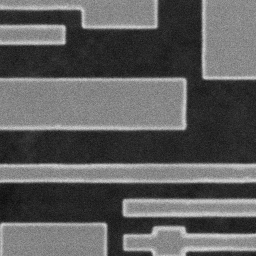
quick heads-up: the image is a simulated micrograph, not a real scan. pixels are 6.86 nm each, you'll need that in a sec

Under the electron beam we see wiring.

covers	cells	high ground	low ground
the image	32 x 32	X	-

XXXXXXXXXXXXXXXXXXXX-----XXXXXXX
----------XXXXXXXXXX-----XXXXXXX
----------XXXXXXXXXX-----XXXXXXX
XXXXXXXX-----------------XXXXXXX
XXXXXXXX-----------------XXXXXXX
-------------------------XXXXXXX
-------------------------XXXXXXX
-------------------------XXXXXXX
-------------------------XXXXXXX
--------------------------XXXXXX
XXXXXXXXXXXXXXXXXXXXXXX---------
XXXXXXXXXXXXXXXXXXXXXXX---------
XXXXXXXXXXXXXXXXXXXXXXX---------
XXXXXXXXXXXXXXXXXXXXXXX---------
XXXXXXXXXXXXXXXXXXXXXXX---------
XXXXXXXXXXXXXXXXXXXXXXX---------
--------------------------------
--------------------------------
--------------------------------
--------------------------------
--------------------------------
XXXXXXXXXXXXXXXXXXXXXXXXXXXXXXXX
XXXXXXXXXXXXXXXXXXXXXXXXXXXXXXXX
--------------------------------
--------------------------------
----------------XXXXXXXXXXXXXXXX
----------------XXXXXXXXXXXXXXXX
--------------------------------
XXXXXXXXXXXXX-------XXX---------
XXXXXXXXXXXXX---XXXXXXXXXXXXXXXX
XXXXXXXXXXXXX---XXXXXXXXXXXXXXXX
XXXXXXXXXXXXX------XXXX---------